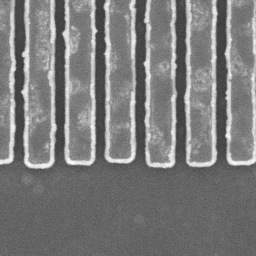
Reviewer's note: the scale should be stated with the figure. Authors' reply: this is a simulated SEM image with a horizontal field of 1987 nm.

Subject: parallel lines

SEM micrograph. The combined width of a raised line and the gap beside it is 313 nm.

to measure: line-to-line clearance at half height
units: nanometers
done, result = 90.2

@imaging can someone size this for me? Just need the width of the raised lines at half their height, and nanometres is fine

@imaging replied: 221